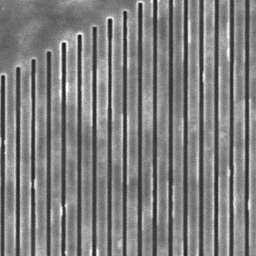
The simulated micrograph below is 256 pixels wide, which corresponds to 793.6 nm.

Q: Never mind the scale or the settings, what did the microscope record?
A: parallel lines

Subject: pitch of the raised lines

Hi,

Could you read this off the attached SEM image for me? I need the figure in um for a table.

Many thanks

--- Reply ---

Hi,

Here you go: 0.0473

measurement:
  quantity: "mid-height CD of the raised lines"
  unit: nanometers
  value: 31.8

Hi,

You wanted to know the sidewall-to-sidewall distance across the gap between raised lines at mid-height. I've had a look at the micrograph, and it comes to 14.3 nm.